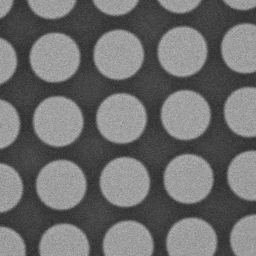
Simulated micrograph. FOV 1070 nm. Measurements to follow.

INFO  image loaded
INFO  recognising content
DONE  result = an array of small figures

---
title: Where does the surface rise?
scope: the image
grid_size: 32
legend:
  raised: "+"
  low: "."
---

+...+++++...+++++...+++++...++++
+...+++++....+++......+.........
................................
......................++.....+++
......++.....++++...+++++...++++
+...+++++...++++++..++++++..++++
++..++++++..++++++..++++++..++++
++..++++++..++++++..++++++..++++
++..++++++..+++++...+++++....+++
+....++++....+++......+.........
................................
......................++.....+++
......+++....++++....+++++..++++
++...+++++..++++++..++++++..++++
++..++++++..++++++..++++++..++++
++..++++++..++++++..++++++..++++
++..++++++...+++++...++++....+++
++...++++.....+++...............
................................
.......................++.....++
......+++.....++++...+++++...+++
++...+++++...+++++...+++++...+++
+++..++++++..++++++..++++++..+++
+++..++++++..++++++..+++++...+++
+++..+++++...+++++...+++++....++
++....++++....+++...............
................................
.......................++.....++
+.....++++....++++...+++++...+++
++...++++++..++++++..++++++..+++
+++..++++++..++++++..++++++..+++
+++..++++++..++++++..++++++..+++